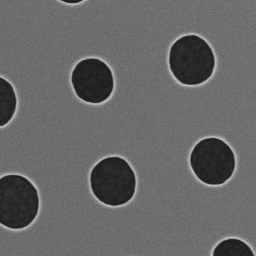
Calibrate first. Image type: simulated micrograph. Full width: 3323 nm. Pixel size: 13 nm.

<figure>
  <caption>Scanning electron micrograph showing holes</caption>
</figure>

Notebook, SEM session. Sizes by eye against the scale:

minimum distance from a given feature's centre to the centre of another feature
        1.32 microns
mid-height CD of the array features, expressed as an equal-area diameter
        601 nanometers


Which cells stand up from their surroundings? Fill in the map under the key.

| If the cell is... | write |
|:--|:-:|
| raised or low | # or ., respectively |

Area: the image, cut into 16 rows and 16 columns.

################
################
###########..###
###########..###
#####..####..###
.####..#########
.###############
.###############
################
############...#
######..####...#
..####..#####.##
..####..########
..##############
################
##############..